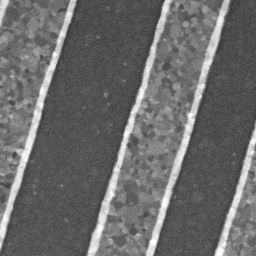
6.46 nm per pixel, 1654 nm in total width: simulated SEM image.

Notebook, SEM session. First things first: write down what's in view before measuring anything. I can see one or a few lines or trenches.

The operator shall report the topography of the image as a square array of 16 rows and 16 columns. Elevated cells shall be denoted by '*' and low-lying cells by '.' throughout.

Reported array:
****......****..
****......****..
****......***...
****.....****...
***......****...
***......****...
**.......***....
**......****....
**......****....
**......***.....
*......****....*
*......****....*
*......***.....*
......****....**
......****....**
......****....**